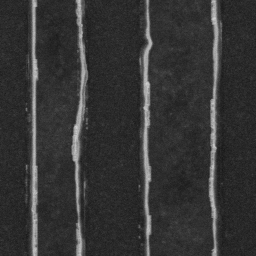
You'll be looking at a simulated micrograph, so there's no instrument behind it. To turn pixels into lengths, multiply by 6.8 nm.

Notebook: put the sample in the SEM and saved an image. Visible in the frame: one or a few lines or trenches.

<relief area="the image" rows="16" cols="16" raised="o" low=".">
..ooo....oooo...
..ooo....oooo...
..ooo....ooooo..
..ooo....oooo...
..ooo....oooo...
..ooo....oooo...
..ooo....oooo...
..ooo....oooo...
..ooo....oooo...
..ooo....oooo...
..ooo....oooo...
..ooo....oooo...
..ooo....oooo...
..ooo....oooo...
..ooo....oooo...
..ooo....oooo...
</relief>